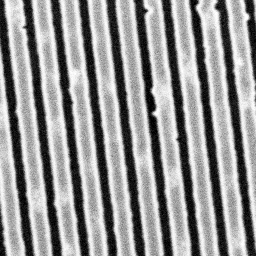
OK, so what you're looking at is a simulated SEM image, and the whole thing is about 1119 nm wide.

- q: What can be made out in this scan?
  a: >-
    parallel lines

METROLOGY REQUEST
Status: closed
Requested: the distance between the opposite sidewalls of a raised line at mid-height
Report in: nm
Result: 72.6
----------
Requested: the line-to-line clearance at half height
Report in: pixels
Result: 10.8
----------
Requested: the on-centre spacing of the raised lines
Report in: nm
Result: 120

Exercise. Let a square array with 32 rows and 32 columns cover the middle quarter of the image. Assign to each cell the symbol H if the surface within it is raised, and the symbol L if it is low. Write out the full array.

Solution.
LHHHHLLLHHHHLLLHHHHLLLHHHHLLLHHH
LHHHHLLLHHHHLLLHHHHLLLHHHHLLLHHH
LHHHHLLLHHHHLLLHHHHLLLHHHHLLLHHH
LLHHHLLLHHHHLLLLHHHLLLHHHHLLLHHH
LLHHHHLLLHHHLLLLHHHHLLLHHHHLLHHH
LLHHHHLLLHHHHLLLHHHHLLHHHHLLLLHH
LLHHHHLLLHHHHLLLHHHHLLHHHHHLLLHH
LLHHHHLLLHHHHLLLHHHHLLHHHHHLLLHH
LLHHHHLLLHHHHLLLHHHHLLLHHHHLLLHH
LLHHHHLLLHHHHLLLHHHHLLLHHHHLLLHH
LLHHHHLLLHHHHLLLHHHHLLLHHHHLLLHH
LLHHHHLLLHHHHHLLHHHHHLLHHHHLLLHH
LLLHHHHLLHHHHHLLLHHHHLLHHHHHLLHH
LLLHHHHLLLHHHHLLHHHHHLLHHHHHLLLH
LLLHHHHLLLHHHHLLLHHHHLLLHHHHLLHH
LLLHHHHLLLHHHHLLLHHHHLLLHHHHLLLH
LLLHHHHLLLHHHHLLLHHHHLLLHHHHLLLH
LLLHHHHLLLHHHHLLLHHHHLLLHHHHLLLH
LLLHHHHLLLHHHHLLLLHHHLLLHHHHLLLH
LLLHHHHLLLHHHHLLLHHHHLLLHHHHLLLH
HLLHHHHHLLHHHHHLLLHHHLLLHHHHLLLH
HLLLHHHHLLHHHHHLLHHHHLLLLHHHLLLH
HLLLHHHHLLLHHHHLLLHHHHLLLHHHLLLH
HLLLHHHHLLLHHHHLLLHHHHLLLHHHHLLL
HLLLHHHHLLLHHHHLLLHHHHLLLHHHHLLL
HLLLHHHHLLLHHHHLLLHHHHLLLHHHHLLL
HLLLHHHHLLLHHHHLLLHHHHLLLHHHHLLL
HLLLHHHHLLLHHHHLLLHHHHLLLHHHHLLL
HHLLLHHHLLLHHHHLLLLHHHHLLHHHHLLL
HHLLLHHHHLLHHHHLLLLHHHHLLLHHHLLL
HHLLLHHHHLLLHHHHLLLHHHHLLLHHHHLL
HHLLLHHHHLLLHHHHLLLHHHHLLLHHHHLL